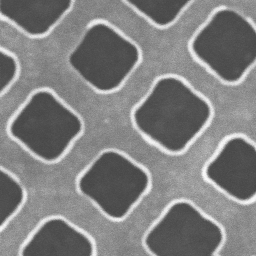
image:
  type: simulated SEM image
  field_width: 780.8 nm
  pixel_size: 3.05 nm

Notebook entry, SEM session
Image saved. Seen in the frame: holes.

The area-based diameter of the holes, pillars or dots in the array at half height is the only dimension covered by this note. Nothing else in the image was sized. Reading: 188 nm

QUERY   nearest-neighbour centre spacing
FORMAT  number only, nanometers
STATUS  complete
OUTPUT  271